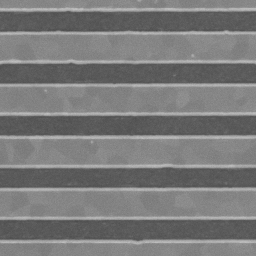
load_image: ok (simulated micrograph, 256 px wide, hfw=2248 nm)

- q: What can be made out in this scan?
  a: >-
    parallel lines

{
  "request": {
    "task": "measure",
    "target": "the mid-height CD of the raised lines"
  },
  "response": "263 nm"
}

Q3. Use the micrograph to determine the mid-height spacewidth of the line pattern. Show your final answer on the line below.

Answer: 198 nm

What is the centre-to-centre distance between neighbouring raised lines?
456 nm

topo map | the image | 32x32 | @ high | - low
@@@@@@@@@@@@@@@@@@@@@@@@@@@@@@@@
--------------------------------
--------------------------------
--------------------------------
@@@@@@@@@@@@@@@@@@@@@@@@@@@@@@@@
@@@@@@@@@@@@@@@@@@@@@@@@@@@@@@@@
@@@@@@@@@@@@@@@@@@@@@@@@@@@@@@@@
@@@@@@@@@@@@@@@@@@@@@@@@@@@@@@@@
--------------------------------
--------------------------------
--------------------------------
@@@@@@@@@@@@@@@@@@@@@@@@@@@@@@@@
@@@@@@@@@@@@@@@@@@@@@@@@@@@@@@@@
@@@@@@@@@@@@@@@@@@@@@@@@@@@@@@@@
--------------------------------
--------------------------------
--------------------------------
@@@@@@@@@@@@@@@@@@@@@@@@@@@@@@@@
@@@@@@@@@@@@@@@@@@@@@@@@@@@@@@@@
@@@@@@@@@@@@@@@@@@@@@@@@@@@@@@@@
@@@@@@@@@@@@@@@@@@@@@@@@@@@@@@@@
--------------------------------
--------------------------------
--------------------------------
@@@@@@@@@@@@@@@@@@@@@@@@@@@@@@@@
@@@@@@@@@@@@@@@@@@@@@@@@@@@@@@@@
@@@@@@@@@@@@@@@@@@@@@@@@@@@@@@@@
--------------------------------
--------------------------------
--------------------------------
@@@@@@@@@@@@@@@@@@@@@@@@@@@@@@@@
@@@@@@@@@@@@@@@@@@@@@@@@@@@@@@@@